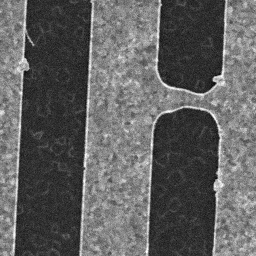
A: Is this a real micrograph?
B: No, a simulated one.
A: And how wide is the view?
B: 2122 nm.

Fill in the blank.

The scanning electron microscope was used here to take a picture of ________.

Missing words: one or a few lines or trenches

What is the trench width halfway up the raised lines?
0.555 um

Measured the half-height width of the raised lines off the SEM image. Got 0.548 µm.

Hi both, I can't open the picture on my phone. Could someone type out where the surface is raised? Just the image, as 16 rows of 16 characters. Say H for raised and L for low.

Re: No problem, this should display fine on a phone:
HHLLLLHHHHLLLLHH
HHLLLLHHHHLLLLHH
HHLLLLHHHHLLLLHH
HHLLLLHHHHLLLLHH
HHLLLLHHHHLLLLHH
HLLLLLHHHHHLLHHH
HLLLLLHHHHHHHHHH
HLLLLHHHHHLLLHHH
HLLLLHHHHHLLLLHH
HLLLLHHHHLLLLLHH
HLLLLHHHHLLLLLHH
HLLLLHHHHLLLLHHH
HLLLLHHHHLLLLLHH
HLLLLHHHHLLLLLHH
HLLLLHHHHLLLLHHH
HLLLLHHHHLLLLHHH